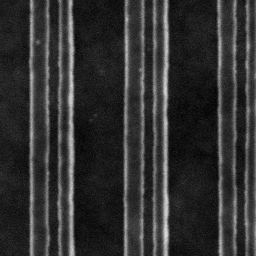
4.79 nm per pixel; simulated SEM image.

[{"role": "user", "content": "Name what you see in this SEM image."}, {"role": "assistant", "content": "lines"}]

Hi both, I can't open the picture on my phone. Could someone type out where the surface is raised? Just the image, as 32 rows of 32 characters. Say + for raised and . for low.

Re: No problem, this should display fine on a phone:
....+++++.......+++++......+++++
....+++++.......+++++......+++++
....+++++.......+++++......+++++
....+++++.......+++++......+++++
....+++++.......+++++......+++++
....+++++.......+++++......+++++
....+++++.......+++++......+++++
....+++++.......+++++......+++++
....+++++.......+++++......+++++
....+++++.......+++++......+++++
....+++++.......+++++......+++++
....+++++.......+++++......+++++
....+++++.......+++++......+++++
....+++++.......+++++......+++++
....+++++.......+++++......+++++
....+++++.......+++++......+++++
....+++++.......+++++......+++++
....+++++.......+++++......+++++
....+++++.......+++++......+++++
....+++++.......+++++......+++++
....+++++.......+++++......+++++
....+++++.......+++++......+++++
....+++++.......+++++......+++++
....+++++.......+++++......+++++
....+++++.......+++++......+++++
....+++++.......+++++......+++++
....+++++.......+++++......+++++
....+++++.......+++++......+++++
....+++++.......+++++......+++++
....+++++.......+++++......+++++
....+++++.......+++++......+++++
....+++++.......+++++......+++++